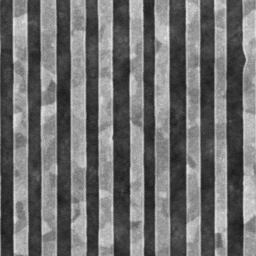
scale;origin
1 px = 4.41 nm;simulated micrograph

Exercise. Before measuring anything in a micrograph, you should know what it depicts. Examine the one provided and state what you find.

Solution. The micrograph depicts parallel lines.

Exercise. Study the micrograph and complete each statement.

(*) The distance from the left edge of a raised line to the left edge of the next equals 28.6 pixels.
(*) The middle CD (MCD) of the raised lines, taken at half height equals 56.8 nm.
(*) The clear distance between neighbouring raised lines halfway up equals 67.9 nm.